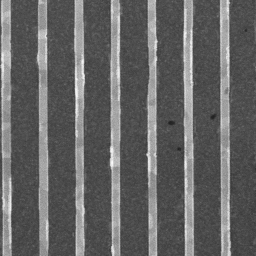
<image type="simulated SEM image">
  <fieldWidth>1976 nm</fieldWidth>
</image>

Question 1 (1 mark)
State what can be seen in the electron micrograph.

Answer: parallel lines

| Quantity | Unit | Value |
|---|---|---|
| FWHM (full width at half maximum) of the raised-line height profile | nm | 62.7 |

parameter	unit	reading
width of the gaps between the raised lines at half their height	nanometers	217